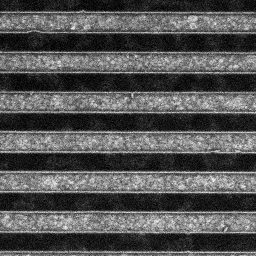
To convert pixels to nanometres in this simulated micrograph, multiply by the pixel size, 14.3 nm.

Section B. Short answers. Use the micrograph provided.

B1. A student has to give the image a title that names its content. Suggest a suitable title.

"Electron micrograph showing parallel lines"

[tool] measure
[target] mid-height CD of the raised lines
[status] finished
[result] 298 nanometres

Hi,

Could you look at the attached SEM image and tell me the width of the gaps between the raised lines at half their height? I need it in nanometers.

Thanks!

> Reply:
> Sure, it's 273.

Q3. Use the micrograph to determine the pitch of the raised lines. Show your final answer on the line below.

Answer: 570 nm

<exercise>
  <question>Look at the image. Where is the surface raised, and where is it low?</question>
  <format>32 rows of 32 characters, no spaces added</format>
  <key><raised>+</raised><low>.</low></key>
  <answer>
++++++++++++++++++++++++++++++++
...........+++++++++++++++++++++
................................
................................
++++++++++++++++++++++++++++++++
++++++++++++++++++++++++++++++++
.........+++++++++++++++++++++++
................................
................................
++++++++++++++++++++++++++++++++
++++++++++++++++++++++++++++++++
...+..++++++++++++++++++++++++++
................................
................................
++++++++++++++++++++++++++++++++
++++++++++++++++++++++++++++++++
...+++++++++++++++++++++++++++++
................................
................................
++++++++++++++++++++++++++++++++
++++++++++++++++++++++++++++++++
.+++++++++++++++++++++++++++++++
................................
................................
++++++++++++++++++++++++++++++++
++++++++++++++++++++++++++++++++
+++++++++++..++++++++++++++++.++
................................
................................
++++++++++++++++++++++++++++++++
++++++++++++++++++++++++++++++++
+...+++.........++......+...++++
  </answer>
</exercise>